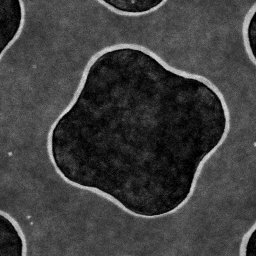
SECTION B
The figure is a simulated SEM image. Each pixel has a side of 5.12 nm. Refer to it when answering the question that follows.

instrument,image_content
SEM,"holes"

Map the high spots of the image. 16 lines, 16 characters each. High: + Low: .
.++++++...++++++
.++++++++++++++.
.++++++++++++++.
++++++...+++++++
+++++......+++++
+++++........+++
+++++.........++
++++..........++
+++...........++
+++..........+++
++++........++++
+++++.......++++
+++++++.....++++
++++++++++++++++
.+++++++++++++++
.++++++++++++++.